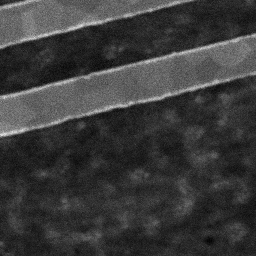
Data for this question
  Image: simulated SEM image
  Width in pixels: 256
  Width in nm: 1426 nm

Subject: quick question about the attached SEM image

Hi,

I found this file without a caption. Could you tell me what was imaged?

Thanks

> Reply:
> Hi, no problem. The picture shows one or a few lines or trenches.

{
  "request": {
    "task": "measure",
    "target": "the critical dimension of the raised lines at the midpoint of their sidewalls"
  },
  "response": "221 nm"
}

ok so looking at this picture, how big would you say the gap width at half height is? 261 nanometers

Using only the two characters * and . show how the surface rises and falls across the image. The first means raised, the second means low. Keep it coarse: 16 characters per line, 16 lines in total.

**********......
******..........
**............**
..........******
......**********
..***********...
********........
****............
................
................
................
................
................
................
................
................